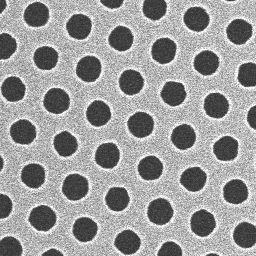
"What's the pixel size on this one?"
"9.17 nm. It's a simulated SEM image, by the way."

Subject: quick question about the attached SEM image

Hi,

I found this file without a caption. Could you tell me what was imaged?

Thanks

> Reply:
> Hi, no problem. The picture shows a regular array of holes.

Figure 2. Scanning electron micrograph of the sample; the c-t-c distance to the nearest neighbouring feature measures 401 nm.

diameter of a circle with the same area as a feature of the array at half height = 235 nanometers